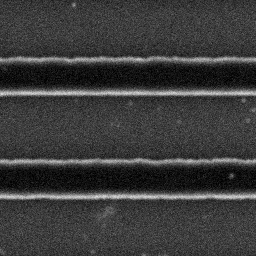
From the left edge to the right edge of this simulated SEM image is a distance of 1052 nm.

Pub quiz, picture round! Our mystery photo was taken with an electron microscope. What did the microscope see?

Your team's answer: lines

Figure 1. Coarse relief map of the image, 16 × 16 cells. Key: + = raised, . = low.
................
................
................
................
++++++++++++++++
++++++++++++++++
................
................
................
................
++++++++++++++++
++++++++++++++++
................
................
................
................